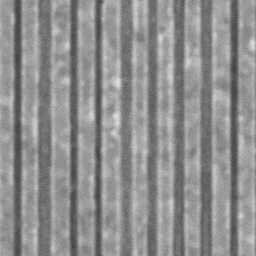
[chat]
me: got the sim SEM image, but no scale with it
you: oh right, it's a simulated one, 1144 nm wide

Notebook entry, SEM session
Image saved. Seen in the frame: parallel lines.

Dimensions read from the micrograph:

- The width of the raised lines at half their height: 69.8 nanometres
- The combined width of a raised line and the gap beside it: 27.1 px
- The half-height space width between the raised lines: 49.2 nanometers